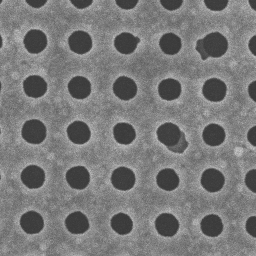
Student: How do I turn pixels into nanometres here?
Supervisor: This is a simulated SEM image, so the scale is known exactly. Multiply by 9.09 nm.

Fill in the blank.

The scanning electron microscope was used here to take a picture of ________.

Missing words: a regular array of holes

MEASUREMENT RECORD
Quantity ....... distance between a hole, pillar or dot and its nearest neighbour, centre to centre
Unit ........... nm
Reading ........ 407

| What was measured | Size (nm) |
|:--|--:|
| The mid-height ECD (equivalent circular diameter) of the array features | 218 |